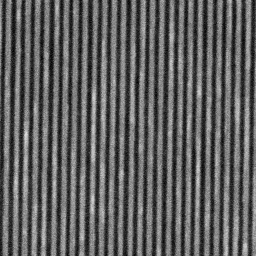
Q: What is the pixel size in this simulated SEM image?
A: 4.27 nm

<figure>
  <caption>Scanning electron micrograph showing parallel lines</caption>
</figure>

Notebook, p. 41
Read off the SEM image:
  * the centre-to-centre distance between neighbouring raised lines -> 40.9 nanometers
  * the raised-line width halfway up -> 19.7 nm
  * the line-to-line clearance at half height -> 0.0203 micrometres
